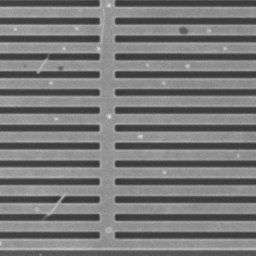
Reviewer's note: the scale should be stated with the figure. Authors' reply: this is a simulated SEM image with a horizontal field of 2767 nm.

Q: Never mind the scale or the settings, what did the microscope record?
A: groups of lines, slits or small figures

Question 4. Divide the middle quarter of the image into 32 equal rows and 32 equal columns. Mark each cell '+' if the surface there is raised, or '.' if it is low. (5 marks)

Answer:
++++++++++++++++++++++++++++++++
++++++++++++++++++++++++++++++++
.........++++...................
........+++++...................
++++++++++++++++++++++++++++++++
++++++++++++++++++++++++++++++++
.........++++...................
.........++++...................
++++++++++++++++++++++++++++++++
++++++++++++++++++++++++++++++++
++++++++++++++++++++++++++++++++
.........++++...................
.........++++...................
++++++++++++++++++++++++++++++++
++++++++++++++++++++++++++++++++
.........++++...................
.........++++...................
++++++++++++++++++++++++++++++++
++++++++++++++++++++++++++++++++
++++++++++++++++++++++++++++++++
.........++++...................
........+++++...................
++++++++++++++++++++++++++++++++
++++++++++++++++++++++++++++++++
.........++++...................
.........++++...................
++++++++++++++++++++++++++++++++
++++++++++++++++++++++++++++++++
........++++++..................
.........++++...................
++++++++++++++++++++++++++++++++
++++++++++++++++++++++++++++++++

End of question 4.